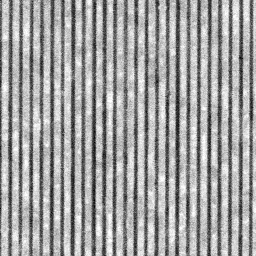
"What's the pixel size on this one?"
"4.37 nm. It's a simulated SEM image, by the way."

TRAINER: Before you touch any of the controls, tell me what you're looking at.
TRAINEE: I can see parallel lines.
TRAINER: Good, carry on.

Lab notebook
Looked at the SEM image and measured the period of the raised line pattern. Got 10.5 pixels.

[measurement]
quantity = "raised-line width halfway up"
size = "26.2 nanometres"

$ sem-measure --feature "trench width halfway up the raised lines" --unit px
4.26